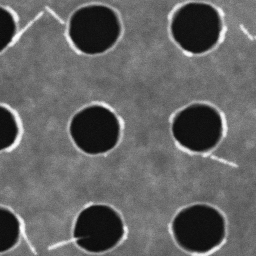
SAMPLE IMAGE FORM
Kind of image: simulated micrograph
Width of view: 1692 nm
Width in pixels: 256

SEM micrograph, holes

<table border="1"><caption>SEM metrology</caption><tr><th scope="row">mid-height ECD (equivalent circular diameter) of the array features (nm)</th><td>328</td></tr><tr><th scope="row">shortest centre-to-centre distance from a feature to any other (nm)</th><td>662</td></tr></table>